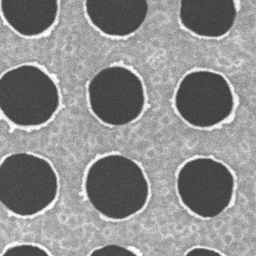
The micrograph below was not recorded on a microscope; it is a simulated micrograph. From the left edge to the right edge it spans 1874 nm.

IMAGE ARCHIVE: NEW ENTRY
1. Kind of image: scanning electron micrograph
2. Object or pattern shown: holes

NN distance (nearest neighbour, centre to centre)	643	nanometres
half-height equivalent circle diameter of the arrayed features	417	nm